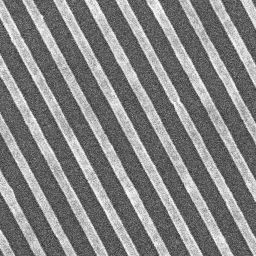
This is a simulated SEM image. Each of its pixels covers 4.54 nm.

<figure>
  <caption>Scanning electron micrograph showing parallel lines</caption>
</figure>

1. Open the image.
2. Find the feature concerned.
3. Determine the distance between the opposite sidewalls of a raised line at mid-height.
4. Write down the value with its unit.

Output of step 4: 38.9 nanometres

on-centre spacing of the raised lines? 125 nm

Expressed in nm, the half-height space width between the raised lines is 85.9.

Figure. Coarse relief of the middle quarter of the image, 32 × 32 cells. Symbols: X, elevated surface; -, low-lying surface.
X-----XXX-----XXX-----XX------XX
XX-----XX------XX------XX-----XX
XX-----XXX-----XXX-----XXX-----X
XXX-----XX------XX------XX-----X
-XX-----XXX-----XXX-----XXX-----
-XXX-----XXX-----XX------XX-----
--XX-----XXX-----XXX-----XXX----
--XXX-----XXX-----XX------XX----
---XX------XX------XX-----XXX---
----XX-----XXX-----XXX-----XX---
----XX------XX-----XXX------XX--
-----XX-----XXX-----XXX-----XX--
-----XX------XX------XX------XX-
-----XXX-----XXX-----XXX-----XXX
X-----XXX-----XX------XX------XX
X------XX-----XXX-----XXX-----XX
XX-----XXX-----XX------XX------X
XX------XX-----XXX-----XXX-----X
-XX-----XXX-----XXX-----XX------
-XX------XX------XX------XX-----
--XX-----XXX-----XXX-----XX-----
--XX------XX------XX------XX----
---XX------XX-----XXX-----XXX---
---XXX-----XX------XX-----XXX---
----XX------XX-----XXX-----XXX--
----XXX-----XX------XXX-----XX--
-----XX------XX-----XXX-----XXX-
-----XXX-----XXX-----XXX-----XX-
------XX------XX-----XXX-----XXX
X-----XXX-----XXX-----XX------XX
X------XX------XX------XX-----XX
XX------XX-----XXX-----XXX-----X